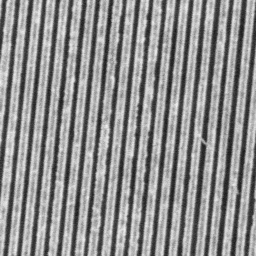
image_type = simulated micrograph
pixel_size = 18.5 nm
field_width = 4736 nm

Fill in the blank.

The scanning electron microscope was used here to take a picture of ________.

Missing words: parallel lines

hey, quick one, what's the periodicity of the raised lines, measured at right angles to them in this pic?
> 246 nanometers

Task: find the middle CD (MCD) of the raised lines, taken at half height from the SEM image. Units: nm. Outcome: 110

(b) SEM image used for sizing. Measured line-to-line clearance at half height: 127 nm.